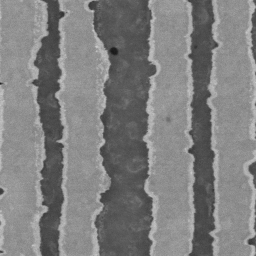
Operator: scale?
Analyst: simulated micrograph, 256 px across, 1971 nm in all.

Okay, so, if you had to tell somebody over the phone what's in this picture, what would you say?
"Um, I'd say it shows one or a few lines or trenches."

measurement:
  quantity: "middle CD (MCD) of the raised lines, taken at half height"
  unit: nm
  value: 293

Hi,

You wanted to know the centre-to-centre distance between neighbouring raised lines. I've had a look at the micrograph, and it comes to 597 nanometres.